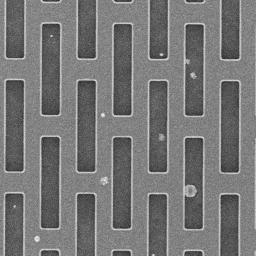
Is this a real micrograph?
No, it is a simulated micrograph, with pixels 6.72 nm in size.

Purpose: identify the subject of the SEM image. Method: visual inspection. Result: groups of lines, slits or small figures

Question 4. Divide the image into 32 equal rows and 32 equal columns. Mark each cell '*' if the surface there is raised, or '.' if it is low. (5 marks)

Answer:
*..*******..*******..*******..**
*..*******..*******..*******..**
*..*******..*******..*******..**
*..**...**..**...**..**..***..**
*..**...**..**...**..**...**..**
*..**...**..**...**..**...**..**
*..**...**..**...**..**...**..**
*****...******...******...**.***
*****...******...******...******
*****...******...******...******
*..**...**..**...**..**...**..**
*..**...**..**...**..**...*...**
*..**...**..**...**..**...*...**
*..**...**..**...**..**...*...**
*..***.***..***.***..***.**...**
*..*******..*******..******...**
*..*******..*******..******...**
*..**..***..**..***..**..**...**
*..**...**..**...**..**...*...**
*..**..***..**...**..**..**...**
*..**..***..**...*...**..**...**
*.***..***.***...**.***..***..**
*****..*******...******..*******
*****..*******...******..*******
*..**..***..**...**..**..***..**
*..**..***..**...*...**..**...**
*..**..***..**...*...**..**...**
*..**..***..**...*...**..**...**
*..**..***..**..**...**..**...**
*..*******..******...******...**
*..*******..******...******...**
*..**..**...**..**...**..**...**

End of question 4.